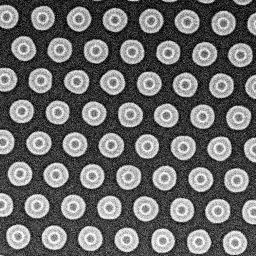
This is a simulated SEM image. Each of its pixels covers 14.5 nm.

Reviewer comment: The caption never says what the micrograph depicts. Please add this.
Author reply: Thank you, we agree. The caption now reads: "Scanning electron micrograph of an array of small figures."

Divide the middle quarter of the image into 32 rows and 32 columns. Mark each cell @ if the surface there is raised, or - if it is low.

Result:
--------------------------------
--------------------------------
-@@@@@----@@@@-----@@@@------@@-
@@@@@@---@@@@@@----@@@@@----@@@@
@@@@@@---@@@@@@---@@@@@@---@@@@@
@@@@@@---@@@@@@---@@@@@@---@@@@@
-@@@@-----@@@@@----@@@@@----@@@@
------------@-------@@@-----@@@@
--------------------------------
--------------------------------
@----@@@@@----@@@@@-----@@@-----
@----@@@@@----@@@@@----@@@@@----
@----@@@@@@---@@@@@@---@@@@@@---
@----@@@@@----@@@@@@---@@@@@@---
------@@@@----@@@@@----@@@@@----
---------------@@@------@@@-----
--------------------------------
-@@@-------@@-------------------
@@@@@----@@@@@-----@@@@-----@@@@
@@@@@@---@@@@@@---@@@@@----@@@@@
@@@@@@---@@@@@@---@@@@@@---@@@@@
@@@@@----@@@@@@---@@@@@@---@@@@@
-@@@@-----@@@@-----@@@@----@@@@@
-----------------------------@@-
--------------------------------
------@@@------@@---------------
@----@@@@@----@@@@@----@@@@-----
@---@@@@@@---@@@@@@---@@@@@@---@
@---@@@@@@---@@@@@@---@@@@@@---@
----@@@@@@---@@@@@@---@@@@@@---@
-----@@@@-----@@@@-----@@@@-----
--------------------------------